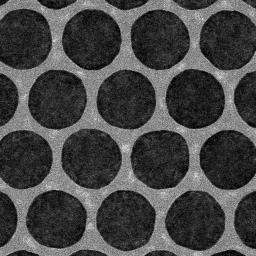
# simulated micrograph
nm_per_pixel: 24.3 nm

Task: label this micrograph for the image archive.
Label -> a regular array of holes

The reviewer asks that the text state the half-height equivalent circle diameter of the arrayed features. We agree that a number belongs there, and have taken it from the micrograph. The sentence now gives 1.46 µm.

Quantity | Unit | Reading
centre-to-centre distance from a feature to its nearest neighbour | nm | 1660